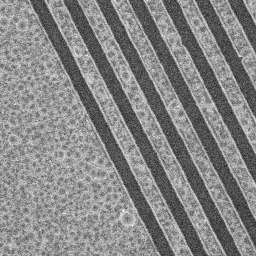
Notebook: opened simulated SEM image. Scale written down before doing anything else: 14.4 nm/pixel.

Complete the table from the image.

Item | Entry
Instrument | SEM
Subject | parallel lines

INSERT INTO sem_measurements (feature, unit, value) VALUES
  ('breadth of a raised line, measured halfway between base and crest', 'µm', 0.208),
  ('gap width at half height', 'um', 0.209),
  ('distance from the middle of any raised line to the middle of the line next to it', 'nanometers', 422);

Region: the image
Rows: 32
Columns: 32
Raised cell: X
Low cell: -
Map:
XXXX--XX--XX--XX--XX--XX---XX--X
XXXX--XX---XX--XX--XX--XX--XX--X
XXXXX--XX--XX--XX--XX--XX---XX--
XXXXX--XX---XX--XX--XX--XX--XX--
XXXXXX--XX--XX--XX--XX--XXX--XX-
XXXXXX---XX--XX--XX--XX--XX--XX-
XXXXXXX--XX--XX--XX--XX--XXX--XX
XXXXXXX---XX--XX--XX--XX--XX--XX
XXXXXXXX--XX--XX--XX--XX---XX--X
XXXXXXXX--XXX--XX--XX--XX--XX--X
XXXXXXXXX--XX--XX--XX--XX---XX--
XXXXXXXXX---XX--XX--XX--XX--XX--
XXXXXXXXXX--XX--XX--XX--XX---XX-
XXXXXXXXXX---XX--XX--XX--XX--XX-
XXXXXXXXXXX--XX--XX--XX--XX---XX
XXXXXXXXXXXX--XX--XX--XX--XX--XX
XXXXXXXXXXXX--XX--XX--XX--XXX--X
XXXXXXXXXXXXX--XX--XX--XX--XX--X
XXXXXXXXXXXXX--XX--XX--XX---XX--
XXXXXXXXXXXXX---XX--XX--XX--XX--
XXXXXXXXXXXXXX--XX--XX--XX---XX-
XXXXXXXXXXXXXXX--XX--XX--XX--XX-
XXXXXXXXXXXXXXX--XX--XX--XX---XX
XXXXXXXXXXXXXXXX--XX--XX--XX--XX
XXXXXXXXXXXXXXXX--XX--XX--XX---X
XXXXXXXXXXXXXXXXX--XX--XX--XX--X
XXXXXXXXXXXXXXXXX--XX--XX--XXX-X
XXXXXXXXXXXXXXXXXX--XX--XX--XX--
XXXXXXXXXXXXXXXXXX--XX--XX---XX-
XXXXXXXXXXXXXXXXXXX--XX--XX--XX-
XXXXXXXXXXXXXXXXXXX--XX--XX---XX
XXXXXXXXXXXXXXXXXXXX--XX--XX--XX